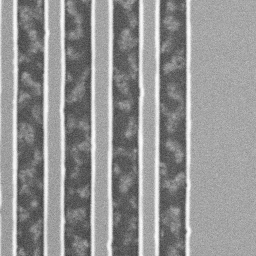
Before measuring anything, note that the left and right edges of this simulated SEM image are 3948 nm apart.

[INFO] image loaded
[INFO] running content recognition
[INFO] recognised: parallel lines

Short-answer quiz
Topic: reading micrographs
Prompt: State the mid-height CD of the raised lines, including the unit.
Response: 262 nanometers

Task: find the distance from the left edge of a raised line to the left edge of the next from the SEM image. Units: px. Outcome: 47.3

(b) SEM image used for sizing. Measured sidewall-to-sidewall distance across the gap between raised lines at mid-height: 468 nm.